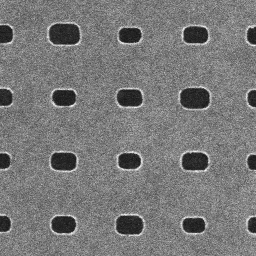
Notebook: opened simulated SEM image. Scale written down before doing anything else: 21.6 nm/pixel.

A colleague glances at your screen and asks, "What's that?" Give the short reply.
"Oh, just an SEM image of a regular array of holes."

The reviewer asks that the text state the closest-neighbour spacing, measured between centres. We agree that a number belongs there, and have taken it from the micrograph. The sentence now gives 1360 nm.